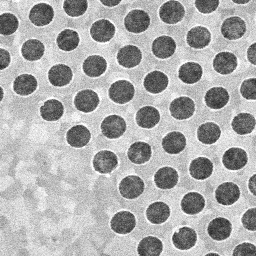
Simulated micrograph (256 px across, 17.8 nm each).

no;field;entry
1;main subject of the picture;a regular array of holes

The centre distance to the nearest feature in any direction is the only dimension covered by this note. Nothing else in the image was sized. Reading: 634 nanometers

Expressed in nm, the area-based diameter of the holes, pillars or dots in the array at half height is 438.